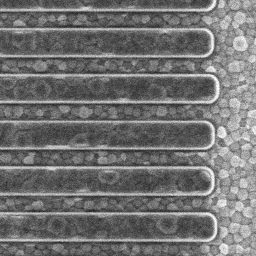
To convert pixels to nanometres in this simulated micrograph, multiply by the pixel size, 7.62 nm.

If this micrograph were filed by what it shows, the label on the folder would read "parallel lines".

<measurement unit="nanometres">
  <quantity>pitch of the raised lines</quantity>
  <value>351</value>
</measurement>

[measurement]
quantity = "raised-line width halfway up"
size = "209 nm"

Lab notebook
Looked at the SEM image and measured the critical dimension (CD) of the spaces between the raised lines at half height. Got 141 nm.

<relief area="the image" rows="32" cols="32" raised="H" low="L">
HHHHHHHHHHHHHHHHHHHHHHHHHHHLLLLL
LLLLLLLLLLLLLLLLLLLLLLLLLLLLLLLL
LLLLLLLLLLLLLLLLLLLLLLLLLLLLLLLL
LLLLLLLLLLLLLLLLLLLLLLLLLLLLLLLL
HHHHHHHHHHHHHHHHHHHHHHHHHHHLLLLL
HHHHHHHHHHHHHHHHHHHHHHHHHHHLLLLL
HHHHHHHHHHHHHHHHHHHHHHHHHHLLLLLL
LLLLLLLLLLLLLLLLLLLLLLLLLLLLLLLL
LLLLLLLLLLLLLLLLLLLLLLLLLLLLLLLL
HHHHHHHHHHHHHHHHHHHHHHHHHHHLLLLL
HHHHHHHHHHHHHHHHHHHHHHHHHHHLLLLL
HHHHHHHHHHHHHHHHHHHHHHHHHHHLLLLL
HHHHHHHHHHHHHHHHHHHHHHHHHHHLLLLL
LLLLLLLLLLLLLLLLLLLLLLLLLLLLLLLL
LLLLLLLLLLLLLLLLLLLLLLLLLLLLLLLL
HHHHHHHHHHHHHHHHHHHHHHHHHHLLLLLL
HHHHHHHHHHHHHHHHHHHHHHHHHHHLLLLL
HHHHHHHHHHHHHHHHHHHHHHHHHHHLLLLL
HHHHHHHHHHHHHHHHHHHHHHHHHHLLLLLL
LLLLLLLLLLLLLLLLLLLLLLLLLLLLLLLL
LLLLLLLLLLLLLLLLLLLLLLLLLLLLLLLL
HHHHHHHHHHHHHHHHHHHHHHHHHHLLLLLL
HHHHHHHHHHHHHHHHHHHHHHHHHHHLLLLL
HHHHHHHHHHHHHHHHHHHHHHHHHHHLLLLL
LLLLLLLLLLLLLLLLLLLLLLLLLLLLLLLL
LLLLLLLLLLLLLLLLLLLLLLLLLLLLLLLL
LLLLLLLLLLLLLLLLLLLLLLLLLLLLLLLL
HHHHHHHHHHHHHHHHHHHHHHHHHHHLLLLL
HHHHHHHHHHHHHHHHHHHHHHHHHHHLLLLL
HHHHHHHHHHHHHHHHHHHHHHHHHHHLLLLL
LLLLLLLLLLLLLLLLLLLLLLLLLLLLLLLL
LLLLLLLLLLLLLLLLLLLLLLLLLLLLLLLL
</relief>